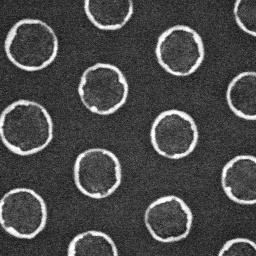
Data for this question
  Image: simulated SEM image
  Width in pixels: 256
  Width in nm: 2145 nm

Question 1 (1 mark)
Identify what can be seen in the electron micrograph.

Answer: raised bodies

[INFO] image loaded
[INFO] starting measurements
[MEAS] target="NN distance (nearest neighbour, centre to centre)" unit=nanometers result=705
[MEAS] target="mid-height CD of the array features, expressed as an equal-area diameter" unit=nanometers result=400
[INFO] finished